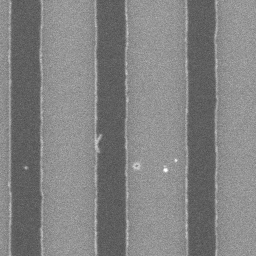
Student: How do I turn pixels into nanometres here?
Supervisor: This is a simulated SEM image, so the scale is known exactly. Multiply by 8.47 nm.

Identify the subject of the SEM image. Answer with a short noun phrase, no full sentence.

lines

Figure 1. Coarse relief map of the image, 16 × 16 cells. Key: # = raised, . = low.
.##...##....##..
.##...##....##..
.##...##....#...
.##...##....##..
.##...##....##..
.##...##....##..
.##...##....##..
.##...##....#...
.##...##....#...
.##...##....##..
.##...##....##..
.##...##....##..
.##...##....##..
.##...##....##..
.##...##....##..
.##...##....##..